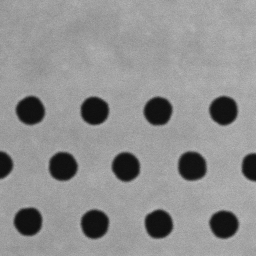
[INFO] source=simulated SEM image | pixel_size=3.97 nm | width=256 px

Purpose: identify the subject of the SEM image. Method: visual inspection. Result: a regular array of holes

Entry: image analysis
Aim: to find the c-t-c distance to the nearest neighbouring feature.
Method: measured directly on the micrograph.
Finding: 254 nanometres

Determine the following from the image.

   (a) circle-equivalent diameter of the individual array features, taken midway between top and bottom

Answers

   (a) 0.111 micrometres